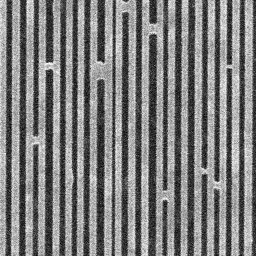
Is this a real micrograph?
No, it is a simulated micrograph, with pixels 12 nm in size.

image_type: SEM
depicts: parallel lines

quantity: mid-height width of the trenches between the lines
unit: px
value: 6.87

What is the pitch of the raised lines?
12.9 pixels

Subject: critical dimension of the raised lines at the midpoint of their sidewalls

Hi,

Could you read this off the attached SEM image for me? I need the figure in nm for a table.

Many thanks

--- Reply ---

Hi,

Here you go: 70.6